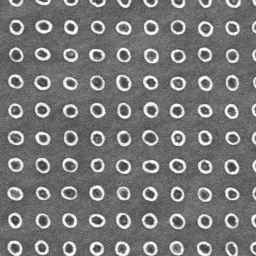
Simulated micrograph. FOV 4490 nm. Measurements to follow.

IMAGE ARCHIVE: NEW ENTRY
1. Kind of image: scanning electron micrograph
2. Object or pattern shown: a regular array of raised bodies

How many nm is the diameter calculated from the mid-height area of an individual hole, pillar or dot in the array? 236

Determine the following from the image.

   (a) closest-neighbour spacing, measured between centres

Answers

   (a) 466 nanometres